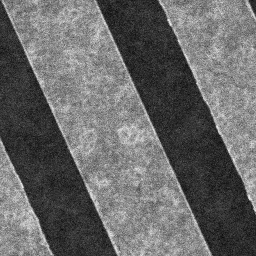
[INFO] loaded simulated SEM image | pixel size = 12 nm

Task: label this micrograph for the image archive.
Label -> one or a few lines or trenches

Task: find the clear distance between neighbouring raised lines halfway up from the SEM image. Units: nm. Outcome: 718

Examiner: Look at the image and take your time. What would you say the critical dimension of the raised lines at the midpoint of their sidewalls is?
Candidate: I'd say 1020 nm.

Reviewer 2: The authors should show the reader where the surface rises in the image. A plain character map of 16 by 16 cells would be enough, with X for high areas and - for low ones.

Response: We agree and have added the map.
XXXXXX----XXXXXX
-XXXXXX----XXXXX
-XXXXXX----XXXXX
--XXXXXX----XXXX
--XXXXXX----XXXX
---XXXXX----XXXX
---XXXXXX----XXX
----XXXXX----XXX
----XXXXXX----XX
----XXXXXX----XX
X----XXXXXX----X
X----XXXXXX----X
XX----XXXXXX----
XX----XXXXXX----
XXX----XXXXXX---
XXX----XXXXXX---